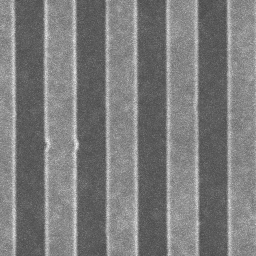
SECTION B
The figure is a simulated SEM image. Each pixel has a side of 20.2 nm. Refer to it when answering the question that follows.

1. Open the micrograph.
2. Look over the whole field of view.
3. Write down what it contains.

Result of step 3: parallel lines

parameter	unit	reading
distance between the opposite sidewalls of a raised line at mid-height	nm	598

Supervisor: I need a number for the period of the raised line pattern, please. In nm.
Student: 1230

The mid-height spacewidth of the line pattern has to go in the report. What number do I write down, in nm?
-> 633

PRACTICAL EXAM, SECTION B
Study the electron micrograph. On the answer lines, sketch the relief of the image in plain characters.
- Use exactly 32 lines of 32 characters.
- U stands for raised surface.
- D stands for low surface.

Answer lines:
UUDDDDUUUDDDDUUUUDDDDUUUUDDDDUUU
UUDDDDUUUDDDDUUUUDDDDUUUUDDDDUUU
UUDDDDUUUDDDDUUUUDDDDUUUUDDDDUUU
UUDDDDUUUDDDDUUUUDDDDUUUUDDDDUUU
UUDDDDUUUDDDDUUUUDDDDUUUUDDDDUUU
UUDDDDUUUDDDDUUUUDDDDUUUUDDDDUUU
UUDDDDUUUDDDDUUUUDDDDUUUUDDDDUUU
UUDDDDUUUDDDDUUUUDDDDUUUUDDDDUUU
UUDDDDUUUDDDDUUUUDDDDUUUUDDDDUUU
UUDDDDUUUDDDDUUUUDDDDUUUUDDDDUUU
UUDDDDUUUDDDDUUUUDDDDUUUUDDDDUUU
UUDDDDUUUDDDDUUUUDDDDUUUUDDDDUUU
UUDDDDUUUDDDDUUUUDDDDUUUUDDDDUUU
UUDDDDUUUDDDDUUUUDDDDUUUUDDDDUUU
UUDDDDUUUDDDDUUUUDDDDUUUUDDDDUUU
UUDDDDUUUDDDDUUUUDDDDUUUUDDDDUUU
UUDDDDUUUDDDDUUUUDDDDUUUUDDDDUUU
UUDDDDUUUDDDDUUUUDDDDUUUUDDDDUUU
UUDDDDUUUUDDDUUUUDDDDUUUUDDDDUUU
UUDDDDUUUDDDDUUUUDDDDUUUUDDDDUUU
UUDDDDUUUDDDDUUUUDDDDUUUUDDDDUUU
UUDDDDUUUDDDDUUUUDDDDUUUUDDDDUUU
UUDDDDUUUDDDDUUUUDDDDUUUUDDDDUUU
UUDDDDUUUDDDDUUUUDDDDUUUUDDDDUUU
UUDDDDUUUDDDDUUUUDDDDUUUUDDDDUUU
UUDDDDUUUDDDDUUUUDDDDUUUUDDDDUUU
UUDDDDUUUDDDDUUUUDDDDUUUUDDDDUUU
UUDDDDUUUDDDDUUUUDDDDUUUUDDDDUUU
UUDDDDUUUDDDDUUUUDDDDUUUUDDDDUUU
UUDDDDUUUDDDDUUUUDDDDUUUUDDDDUUU
UUDDDDUUUDDDDUUUUDDDDUUUUDDDDUUU
UUDDDDUUUDDDDUUUUDDDDUUUUDDDDUUU